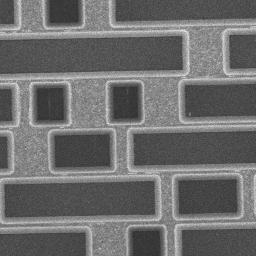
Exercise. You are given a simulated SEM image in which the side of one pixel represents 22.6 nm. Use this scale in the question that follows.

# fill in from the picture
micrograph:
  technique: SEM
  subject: parallel lines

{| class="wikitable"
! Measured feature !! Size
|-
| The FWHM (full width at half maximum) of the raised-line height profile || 229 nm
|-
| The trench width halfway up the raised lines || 0.882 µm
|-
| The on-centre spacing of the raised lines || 48.5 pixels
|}